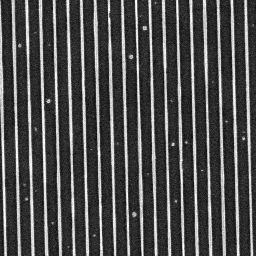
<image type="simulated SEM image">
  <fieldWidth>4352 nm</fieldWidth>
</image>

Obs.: parallel lines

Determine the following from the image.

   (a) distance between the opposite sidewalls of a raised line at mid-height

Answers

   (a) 31.9 nm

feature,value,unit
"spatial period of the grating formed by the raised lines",13.7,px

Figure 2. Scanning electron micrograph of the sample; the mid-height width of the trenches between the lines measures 0.196 microns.